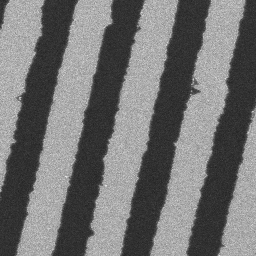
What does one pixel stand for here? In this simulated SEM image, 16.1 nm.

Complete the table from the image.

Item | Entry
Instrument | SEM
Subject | one or a few lines or trenches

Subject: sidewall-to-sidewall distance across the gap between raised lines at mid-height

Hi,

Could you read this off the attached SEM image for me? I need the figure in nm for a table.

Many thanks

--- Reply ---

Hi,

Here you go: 520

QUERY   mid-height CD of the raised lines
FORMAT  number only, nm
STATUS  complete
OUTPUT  534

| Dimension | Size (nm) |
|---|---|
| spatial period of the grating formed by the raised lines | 1050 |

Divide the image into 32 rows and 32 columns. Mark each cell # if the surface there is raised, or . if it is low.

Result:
#....#####....####....####....##
#....####.....####....####....##
#....####.....####....####....##
.....####....####....#####....##
.....####....####....####.....##
....#####....####....####....###
....####....#####....####....###
....####....####.....####....###
....####....####....#####....###
...####.....####....####....####
...####....####.....#####...####
...####....####.....#####...####
..#####....####....#####....####
...###.....####....####.....####
..####....#####....####....#####
..####....####.....####....####.
..####....####....#####....####.
..####....####....####.....####.
.####.....####....####....#####.
.####....####.....####....####..
.####....####....#####....####..
.####....####....####.....####..
#####...#####....####....#####..
####....#####....####....####...
####....####....#####....####...
####....####....#####....####...
####....####....####....#####...
###....#####....####....####....
###....#####....####....####....
###....#####...####.....####....
##.....####....####.....####....
##....#####....####....#####....